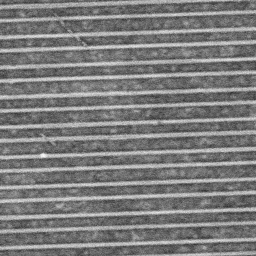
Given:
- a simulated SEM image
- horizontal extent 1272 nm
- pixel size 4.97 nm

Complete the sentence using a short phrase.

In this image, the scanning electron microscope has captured parallel lines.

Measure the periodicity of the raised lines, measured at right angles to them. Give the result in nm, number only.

75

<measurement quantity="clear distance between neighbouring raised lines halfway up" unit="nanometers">56.5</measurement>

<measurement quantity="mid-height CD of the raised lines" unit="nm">14.3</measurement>